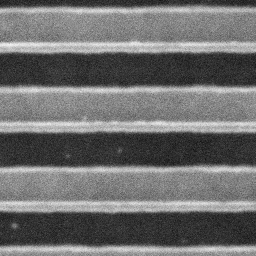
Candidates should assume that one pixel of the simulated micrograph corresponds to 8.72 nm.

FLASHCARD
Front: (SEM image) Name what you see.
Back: lines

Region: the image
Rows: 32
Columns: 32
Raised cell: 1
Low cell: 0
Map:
00000000000000000000000000000000
11111111111111111111111111111111
11111111111111111111111111111111
11111111111111111111111111111111
11111111111111111111111111111111
11111111111111111111111111111111
00001110011110000001000000000010
00000000000000000000000000000000
00000000000000000000000000000000
00000000000000000000000000000000
00000000000000000000000000000000
11111111111111111111111111111111
11111111111111111111111111111111
11111111111111111111111111111111
11111111111111111111111111111111
11111111111111111111111111111111
00000000000000000000000000000000
00000000000000000000000000000000
00000000000000000000000000000000
00000000000000000000000000000000
00000000000000000000000000000000
11111111111111111111111111111111
11111111111111111111111111111111
11111111111111111111111111111111
11111111111111111111111111111111
11111111111111111111111111111111
00000000000000000000000000000000
00000000000000000000000000000000
00000000000000000000000000000000
00000000000000000000000000000000
00000000000000000000000000000000
11111111111111111111111111111111